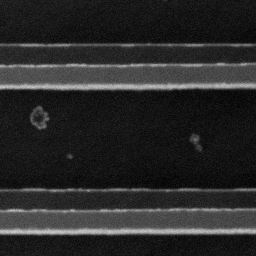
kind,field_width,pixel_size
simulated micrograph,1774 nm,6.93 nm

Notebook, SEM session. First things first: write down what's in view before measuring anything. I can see lines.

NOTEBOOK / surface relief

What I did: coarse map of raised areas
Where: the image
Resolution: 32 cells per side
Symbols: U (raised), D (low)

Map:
DDDDDDDDDDDDDDDDDDDDDDDDDDDDDDDD
DDDDDDDDDDDDDDDDDDDDDDDDDDDDDDDD
DDDDDDDDDDDDDDDDDDDDDDDDDDDDDDDD
DDDDDDDDDDDDDDDDDDDDDDDDDDDDDDDD
DDDDDDDDDDDDDDDDDDDDDDDDDDDDDDDD
DDDDDDDDDDDDDDDDDDDDDDDDDDDDDDDD
UUUUUUUUUUUUUUUUUUUUUUUUUUUUUUUU
UUUUUUUUUUUUUUUUUUUUUUUUUUUUUUUU
UUUUUUUUUUUUUUUUUUUUUUUUUUUUUUUU
UUUUUUUUUUUUUUUUUUUUUUUUUUUUUUUU
UUUUUUUUUUUUUUUUUUUUUUUUUUUUUUUU
DDDDDDDDDDDDDDDDDDDDDDDDDDDDDDDD
DDDDDDDDDDDDDDDDDDDDDDDDDDDDDDDD
DDDDDDDDDDDDDDDDDDDDDDDDDDDDDDDD
DDDDDDDDDDDDDDDDDDDDDDDDDDDDDDDD
DDDDDDDDDDDDDDDDDDDDDDDDDDDDDDDD
DDDDDDDDDDDDDDDDDDDDDDDDDDDDDDDD
DDDDDDDDDDDDDDDDDDDDDDDDDDDDDDDD
DDDDDDDDDDDDDDDDDDDDDDDDDDDDDDDD
DDDDDDDDDDDDDDDDDDDDDDDDDDDDDDDD
DDDDDDDDDDDDDDDDDDDDDDDDDDDDDDDD
DDDDDDDDDDDDDDDDDDDDDDDDDDDDDDDD
DDDDDDDDDDDDDDDDDDDDDDDDDDDDDDDD
DDDDDDDDDDDDDDDDDDDDDDDDDDDDDDDD
UUUUUUUUUUUUUUUUUUUUUUUUUUUUUUUU
UUUUUUUUUUUUUUUUUUUUUUUUUUUUUUUU
UUUUUUUUUUUUUUUUUUUUUUUUUUUUUUUU
UUUUUUUUUUUUUUUUUUUUUUUUUUUUUUUU
UUUUUUUUUUUUUUUUUUUUUUUUUUUUUUUU
DDDDDDDDDDDDDDDDDDDDDDDDDDDDDDDD
DDDDDDDDDDDDDDDDDDDDDDDDDDDDDDDD
DDDDDDDDDDDDDDDDDDDDDDDDDDDDDDDD